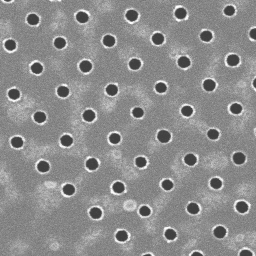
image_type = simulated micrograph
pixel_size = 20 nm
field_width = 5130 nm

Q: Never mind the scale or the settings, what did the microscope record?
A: a regular array of holes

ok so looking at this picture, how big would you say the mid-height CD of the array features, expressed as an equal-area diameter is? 244 nanometers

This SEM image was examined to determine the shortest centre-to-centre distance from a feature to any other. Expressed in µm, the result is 0.683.